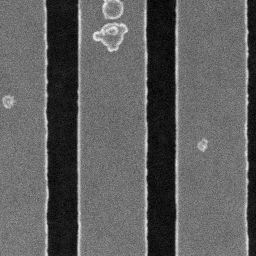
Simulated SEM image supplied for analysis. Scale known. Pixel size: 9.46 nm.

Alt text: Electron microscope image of lines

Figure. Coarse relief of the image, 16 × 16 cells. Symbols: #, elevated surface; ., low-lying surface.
###..####..####.
###..####..####.
###..####..####.
###..####..####.
###..####..####.
###..####..####.
###..####..####.
###..####..####.
###..####..####.
###..####..####.
###..####..####.
###..####..####.
###..####..####.
###..####..####.
###..####..####.
###..####..####.